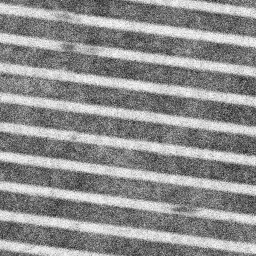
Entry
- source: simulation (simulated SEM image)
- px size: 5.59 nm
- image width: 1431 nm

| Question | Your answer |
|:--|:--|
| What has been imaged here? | parallel lines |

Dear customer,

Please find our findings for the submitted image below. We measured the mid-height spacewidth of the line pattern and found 118 nm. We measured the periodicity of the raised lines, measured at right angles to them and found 164 nm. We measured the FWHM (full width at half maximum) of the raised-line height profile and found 46.4 nm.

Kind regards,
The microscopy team